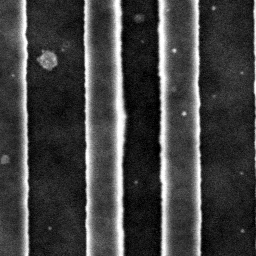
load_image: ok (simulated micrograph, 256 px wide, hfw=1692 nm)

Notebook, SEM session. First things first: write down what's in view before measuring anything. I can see lines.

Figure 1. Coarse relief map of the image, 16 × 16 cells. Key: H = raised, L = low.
HHLLLHHLLLHHLLLL
HHLLLHHLLLHHLLLL
HHLLLHHLLLHHLLLL
HHLLLHHLLLHHLLLL
HHLLLHHLLLHHLLLL
HHLLLHHLLLHHLLLL
HHLLLHHLLLHHLLLL
HHLLLHHHLLHHLLLL
HHLLLHHHLLHHLLLL
HHLLLHHHLLHHLLLL
HHLLLHHHLLHHLLLL
HHLLLHHHLLHHLLLL
HHLLLHHHLLHHLLLL
HHLLLHHHLLHHHLLL
HHLLLHHHLLHHLLLL
HHLLLHHHLLHHLLLL